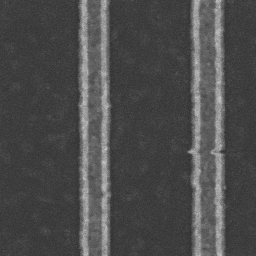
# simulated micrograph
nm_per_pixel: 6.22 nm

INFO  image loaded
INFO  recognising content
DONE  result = one or a few lines or trenches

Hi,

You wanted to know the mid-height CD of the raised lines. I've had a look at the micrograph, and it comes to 129 nm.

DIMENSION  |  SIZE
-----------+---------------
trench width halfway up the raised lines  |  580 nm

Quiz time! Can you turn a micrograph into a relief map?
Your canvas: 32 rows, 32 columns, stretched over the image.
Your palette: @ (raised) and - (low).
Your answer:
-----------@@------------@@-----
-----------@@------------@@-----
-----------@@------------@@-----
-----------@@------------@@-----
-----------@@------------@@-----
-----------@@------------@@-----
-----------@@------------@@-----
-----------@@------------@@-----
-----------@@------------@@-----
-----------@@------------@@-----
-----------@@------------@@-----
-----------@@------------@@-----
-----------@@------------@@-----
-----------@@------------@@-----
-----------@@------------@@-----
-----------@@------------@@-----
-----------@@------------@@-----
-----------@@------------@@-----
-----------@@------------@@-----
----------@@@------------@@-----
-----------@@------------@@-----
-----------@@------------@@-----
-----------@@------------@@-----
-----------@@------------@@-----
-----------@@------------@@-----
-----------@@------------@@-----
-----------@@------------@@-----
-----------@@------------@@-----
-----------@@------------@@-----
-----------@@------------@@-----
-----------@@------------@@-----
-----------@@------------@@-----